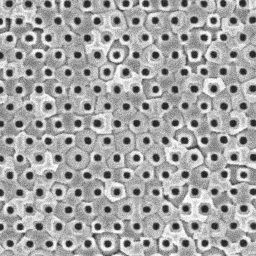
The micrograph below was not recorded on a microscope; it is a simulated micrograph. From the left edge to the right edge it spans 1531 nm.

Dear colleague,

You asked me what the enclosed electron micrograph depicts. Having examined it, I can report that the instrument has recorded a regular array of holes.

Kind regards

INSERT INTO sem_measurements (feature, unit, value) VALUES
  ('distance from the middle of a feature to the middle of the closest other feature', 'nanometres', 113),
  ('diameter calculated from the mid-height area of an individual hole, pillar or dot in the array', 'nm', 45.8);